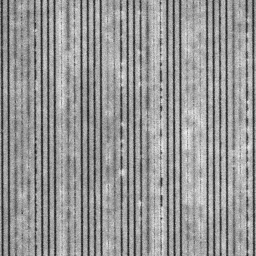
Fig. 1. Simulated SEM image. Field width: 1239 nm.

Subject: parallel lines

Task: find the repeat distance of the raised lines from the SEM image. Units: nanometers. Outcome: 32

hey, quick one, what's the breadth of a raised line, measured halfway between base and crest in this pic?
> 0.0266 microns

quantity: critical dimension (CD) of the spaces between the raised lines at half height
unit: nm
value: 8.5